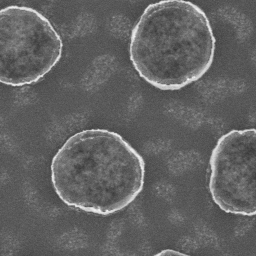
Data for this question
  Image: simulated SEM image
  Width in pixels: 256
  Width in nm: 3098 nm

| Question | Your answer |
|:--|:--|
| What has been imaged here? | raised bodies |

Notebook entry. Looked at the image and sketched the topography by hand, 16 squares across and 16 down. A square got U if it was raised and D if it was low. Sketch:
DDDDDDDDDUUUDDDD
UUUDDDDDDUUUUDDD
UUUUDDDDUUUUUDDD
UUUUDDDDUUUUUDDD
UUUDDDDDDUUUUDDD
DDDDDDDDDDDDDDDD
DDDDDDDDDDDDDDDD
DDDDDDDDDDDDDDDD
DDDDDUUDDDDDDDUU
DDDDUUUUDDDDDUUU
DDDUUUUUUDDDDUUU
DDDUUUUUUDDDDUUU
DDDDUUUUDDDDDUUU
DDDDDDDDDDDDDDDD
DDDDDDDDDDDDDDDD
DDDDDDDDDDDDDDDD